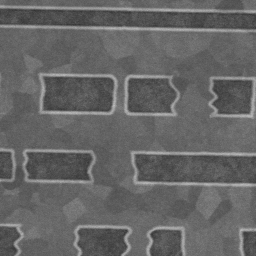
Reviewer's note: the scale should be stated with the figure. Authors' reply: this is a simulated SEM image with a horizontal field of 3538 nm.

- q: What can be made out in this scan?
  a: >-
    one or a few lines or trenches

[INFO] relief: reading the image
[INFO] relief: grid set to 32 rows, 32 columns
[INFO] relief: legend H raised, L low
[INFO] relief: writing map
HHHHHHHHHHHHHHHHHHHHHHHHHHHHHHHH
LLLLLLLLLLLLLLLLLLLLLLLLLLLLLLLL
LLLLLLLLLLLLLLLLLLLLLLLLLLLLLLLL
HHHHHHHLLLLLLLLLLLLLLLLLLLLLLLLL
HHHHHHHHHHHHHHHHHHHHHHHHHHHHHHHH
HHHHHHHHHHHHHHHHHHHHHHHHHHHHHHHH
HHHHHHHHHHHHHHHHHHHHHHHHHHHHHHHH
HHHHHHHHHHHHHHHHHHHHHHHHHHHHHHHH
HHHHHHHHHHHHHHHHHHHHHHHHHHHHHHHH
HHHHHLLLLLLLLHHHHLHHHHHHHHHHHHHH
HHHHHLLLLLLLLLLHLLLLLHHHHHLLLLLL
HHHHHLLLLLLLLLHHLLLLLLHHHHLLLLLL
HHHHHLLLLLLLLLHHLLLLLLHHHHHLLLLL
HHHHHLLLLLLLLLHHLLLLLLHHHHHLLLLL
HHHHHHHHHHHHHHHHHHHHHHHHHHHHHLLH
HHHHHHHHHHHHHHHHHHHHHHHHHHHHHHHH
HHHHHHHHHHHHHHHHHHHHHHHHHHHHHHHH
HHHHHHHHHHHHHHHHHHHHHHHHHHHHHHHH
HHHHHHHHHHHHHHHHHHHHHHHHHHHHHHHH
LLHLLLLLLLLLHHHHHLLLLLLLLLLLLLLL
LLHLLLLLLLLLHHHHHLLLLLLLLLLLLLLL
LLHLLLLLLLLHHHHHHLLLLLLLLLLLLLLL
LHHHLLLLLLLHHHHHHLLLLLLLLLLLLLLL
HHHHHHHHHHHHHHHHHHHHHHHHHHHHHHHH
HHHHHHHHHHHHHHHHHHHHHHHHHHHHHHHH
HHHHHHHHHHHHHHHHHHHHHHHHHHHHHHHH
HHHHHHHHHHHHHHHHHHHHHHHHHHHHHHHH
HHHHHHHHHHHHHHHHHHHHHHHHHHHHHHHH
LLHHHHHHHHLLLLLLHHHHLLHHHHHHHHHH
LLLHHHHHHHLLLLLLHHHLLLLHHHHHHHLL
LLHHHHHHHLLLLLLLHHHLLLLHHHHHHHLL
LLHHHHHHHHLLLLLLHHLLLLLHHHHHHHLL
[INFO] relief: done